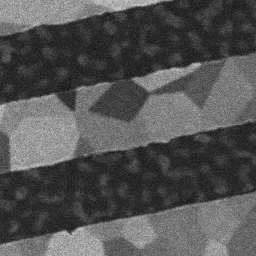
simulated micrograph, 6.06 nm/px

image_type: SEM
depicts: one or a few lines or trenches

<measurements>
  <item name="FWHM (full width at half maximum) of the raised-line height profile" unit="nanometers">404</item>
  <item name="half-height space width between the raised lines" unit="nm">421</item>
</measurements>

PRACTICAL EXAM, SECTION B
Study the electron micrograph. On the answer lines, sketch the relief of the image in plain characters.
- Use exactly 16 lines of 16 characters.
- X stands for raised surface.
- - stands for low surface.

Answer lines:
XXXXXXXX--------
XXX-------------
----------------
---------------X
----------XXXXXX
-----XXXXXXXXXXX
XXXXXXXXXXXXXXXX
XXXXXXXXXXXXXXXX
XXXXXXXXXXX-----
XXXXXX----------
XX--------------
----------------
--------------XX
---------XXXXXXX
----XXXXXXXXXXXX
XXXXXXXXXXXXXXXX